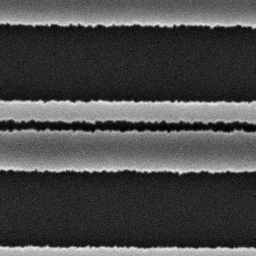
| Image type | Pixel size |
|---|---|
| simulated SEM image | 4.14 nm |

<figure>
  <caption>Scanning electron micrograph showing lines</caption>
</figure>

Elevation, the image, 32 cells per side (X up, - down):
XXXXXXXXXXXXXXXXXXXXXXXXXXXXXXXX
XXXXXXXXXXXXXXXXXXXXXXXXXXXXXXXX
XXXXXXXXXXXXXXXXXXXXXXXXXXXXXXXX
--------------------------------
--------------------------------
--------------------------------
--------------------------------
--------------------------------
--------------------------------
--------------------------------
--------------------------------
--------------------------------
--------------------------------
XXXXXXXXXXXXXXXXXXXXXXXXXXXXXXXX
XXXXXXXXXXXXXXXXXXXXXXXXXXXXXXXX
XXXXXXXXXXXXXXXXXXXXXXXXXXXXXXXX
XXXXXXXXXXXXXXXXXXXXXXXXXXXXXXXX
XXXXXXXXXXXXXXXXXXXXXXXXXXXXXXXX
XXXXXXXXXXXXXXXXXXXXXXXXXXXXXXXX
XXXXXXXXXXXXXXXXXXXXXXXXXXXXXXXX
XXXXXXXXXXXXXXXXXXXXXXXXXXXXXXXX
----------------------X---------
--------------------------------
--------------------------------
--------------------------------
--------------------------------
--------------------------------
--------------------------------
--------------------------------
--------------------------------
--------------------------------
XXXXXXXXXXXXXXXXXXXXXXXXXXXXXXXX